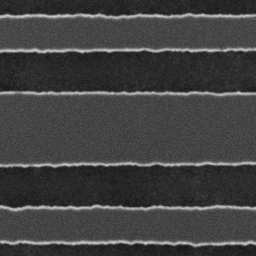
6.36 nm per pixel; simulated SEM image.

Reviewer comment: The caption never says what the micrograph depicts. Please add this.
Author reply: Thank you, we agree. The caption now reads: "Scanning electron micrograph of lines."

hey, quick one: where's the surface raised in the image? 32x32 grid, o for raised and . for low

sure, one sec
................................
................................
oooooooooooooooooooooooooooooooo
oooooooooooooooooooooooooooooooo
oooooooooooooooooooooooooooooooo
oooooooooooooooooooooooooooooooo
.....o..........................
................................
................................
................................
................................
................................
oooooooooooooooooooooooooooooooo
oooooooooooooooooooooooooooooooo
oooooooooooooooooooooooooooooooo
oooooooooooooooooooooooooooooooo
oooooooooooooooooooooooooooooooo
oooooooooooooooooooooooooooooooo
oooooooooooooooooooooooooooooooo
oooooooooooooooooooooooooooooooo
ooooooooooooooooooooooooooooooo.
................................
................................
................................
................................
................................
oooooooooooooooooooooooooooooooo
oooooooooooooooooooooooooooooooo
oooooooooooooooooooooooooooooooo
oooooooooooooooooooooooooooooooo
.....................o.ooooo..o.
................................